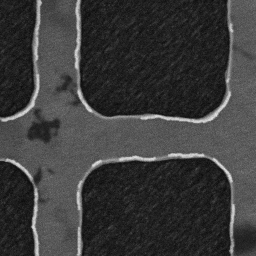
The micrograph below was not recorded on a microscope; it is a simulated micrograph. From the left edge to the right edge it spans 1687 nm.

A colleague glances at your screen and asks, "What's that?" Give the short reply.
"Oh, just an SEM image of holes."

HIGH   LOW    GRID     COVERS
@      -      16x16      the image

--@@@---------@@
--@@@---------@@
--@@@---------@@
--@@@---------@@
--@@@---------@@
--@@@---------@@
--@@@---------@@
@@@@@@@@@@@@@@@@
@@@@@@@@@@@@@@@@
@@@@@@@@@@@@@@@@
-@@@@@--------@@
--@@@---------@@
--@@@---------@@
--@@@---------@@
--@@@---------@@
--@@@---------@@